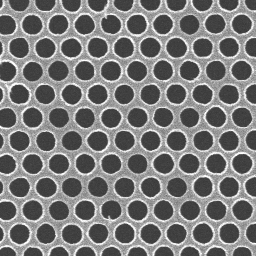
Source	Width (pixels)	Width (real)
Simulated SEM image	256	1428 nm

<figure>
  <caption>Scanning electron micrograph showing a regular array of holes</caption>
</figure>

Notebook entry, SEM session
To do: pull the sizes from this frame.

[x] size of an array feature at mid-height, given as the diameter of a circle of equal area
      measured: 0.109 um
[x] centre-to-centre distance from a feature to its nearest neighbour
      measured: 26.1 px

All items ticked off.